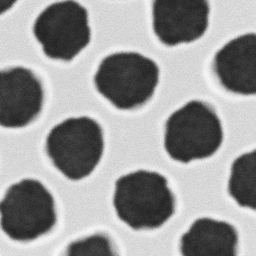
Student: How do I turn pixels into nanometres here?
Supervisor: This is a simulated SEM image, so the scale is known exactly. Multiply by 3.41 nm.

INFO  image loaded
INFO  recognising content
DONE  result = holes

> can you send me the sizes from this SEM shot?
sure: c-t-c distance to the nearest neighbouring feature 287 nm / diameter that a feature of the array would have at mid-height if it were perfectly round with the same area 0.206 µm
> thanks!